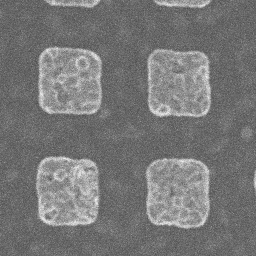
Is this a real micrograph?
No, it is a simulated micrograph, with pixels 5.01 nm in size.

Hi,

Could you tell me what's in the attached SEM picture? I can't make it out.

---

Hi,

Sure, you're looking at raised bodies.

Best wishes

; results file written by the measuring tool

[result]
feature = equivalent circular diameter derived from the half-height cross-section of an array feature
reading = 64.9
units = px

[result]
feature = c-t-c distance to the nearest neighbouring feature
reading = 547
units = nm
